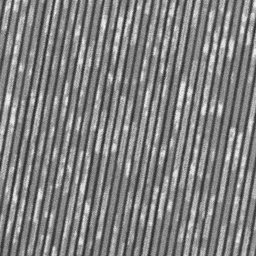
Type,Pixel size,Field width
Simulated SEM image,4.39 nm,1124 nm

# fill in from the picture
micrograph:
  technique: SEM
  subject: parallel lines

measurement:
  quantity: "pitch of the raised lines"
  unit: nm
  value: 35.6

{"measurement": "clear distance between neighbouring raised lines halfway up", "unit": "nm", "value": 15.6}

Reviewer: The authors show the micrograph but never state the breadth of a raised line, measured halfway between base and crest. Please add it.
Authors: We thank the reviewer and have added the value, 19.5 nanometres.